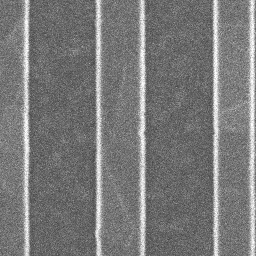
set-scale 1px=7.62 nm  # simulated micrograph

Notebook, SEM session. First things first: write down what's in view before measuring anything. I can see one or a few lines or trenches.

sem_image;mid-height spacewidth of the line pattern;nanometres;553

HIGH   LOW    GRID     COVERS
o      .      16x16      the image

oo....ooo....ooo
oo....ooo....ooo
oo....ooo....ooo
oo....ooo....ooo
oo....ooo....ooo
oo....ooo....ooo
oo....ooo.....oo
oo....ooo.....oo
oo....ooo.....oo
oo....ooo.....oo
oo....ooo.....oo
oo....ooo.....oo
oo....ooo.....oo
oo....ooo.....oo
oo....ooo.....oo
oo....ooo.....oo